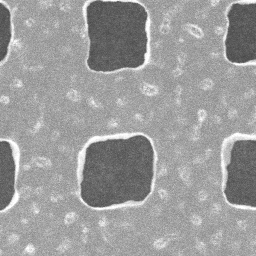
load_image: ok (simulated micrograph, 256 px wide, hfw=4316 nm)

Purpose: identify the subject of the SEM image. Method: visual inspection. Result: holes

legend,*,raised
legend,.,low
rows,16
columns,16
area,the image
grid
******...*****..
.****....*****..
.*****...*****..
******...*****..
****************
****************
****************
****************
****************
.****.....****..
.****.....****..
.****.....****..
.****....*****..
****************
****************
****************